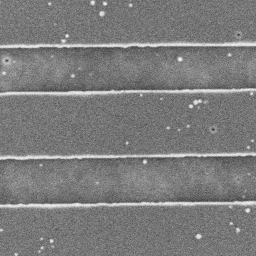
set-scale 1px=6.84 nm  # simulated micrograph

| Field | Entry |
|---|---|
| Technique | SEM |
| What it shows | lines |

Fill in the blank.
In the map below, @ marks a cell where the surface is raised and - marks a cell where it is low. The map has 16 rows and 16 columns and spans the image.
@@@@@@@@@@@@@@@@
@@@@@@@@@@@@@@@@
@@@@@@@@@@@@@@@@
----------------
----------------
----------------
@@@@@@@@@@@@@@@@
@@@@@@@@@@@@@@@@
@@@@@@@@@@@@@@@@
@@@@@@@@@@@@@@@@
----------------
----------------
----------------
@@@@@@@@@@@@@@@@
@@@@@@@@@@@@@@@@
@@@@@@@@@@@@@@@@